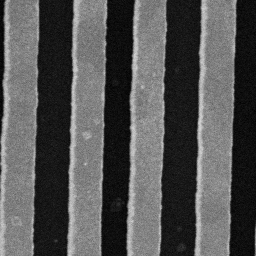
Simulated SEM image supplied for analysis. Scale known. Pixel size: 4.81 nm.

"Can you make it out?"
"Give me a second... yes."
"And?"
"lines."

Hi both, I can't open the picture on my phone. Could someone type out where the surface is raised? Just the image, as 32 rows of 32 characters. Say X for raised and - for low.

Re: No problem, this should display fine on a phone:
-XXXX----XXXX----XXXX----XXXXX--
-XXXX----XXXX----XXXX----XXXXX--
-XXXX----XXXX----XXXX----XXXX---
-XXXX----XXXX----XXXX----XXXX---
-XXXX----XXXX----XXXX----XXXX---
-XXXX----XXXX----XXXX----XXXX---
-XXXX----XXXX----XXXX----XXXX---
-XXXX----XXXX----XXXX----XXXX---
-XXXX----XXXX----XXXX----XXXX---
XXXXX----XXXX----XXX-----XXXX---
XXXXX----XXXX---XXXX-----XXXX---
XXXXX----XXXX---XXXX-----XXXX---
-XXXX----XXXX---XXXX-----XXXX---
XXXXX----XXXX---XXXX-----XXXX---
XXXX-----XXXX---XXXX-----XXXX---
XXXXX----XXXX---XXXX-----XXXX---
XXXX-----XXXX---XXXX-----XXXX---
XXXX-----XXXX---XXXX-----XXXX---
XXXX-----XXXX---XXXX-----XXXX---
XXXX-----XXXX---XXXX-----XXXX---
XXXX-----XXXX---XXXX-----XXXX---
XXXX-----XXXX---XXXX-----XXXX---
XXXX-----XXXX---XXXX-----XXXX---
XXXX-----XXXX---XXXX-----XXXX---
XXXX-----XXXX---XXXX----XXXXX---
XXXX-----XXXX---XXXX----XXXXX---
XXXX-----XXXX---XXXX----XXXXX---
XXXX-----XXXX---XXXX-----XXXX---
XXXX-----XXXX---XXXX-----XXXX---
XXXX-----XXXX---XXXX----XXXXX---
XXXX-----XXXX---XXXX----XXXXX---
XXXX----XXXXX---XXXX----XXXXX---